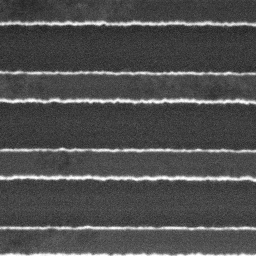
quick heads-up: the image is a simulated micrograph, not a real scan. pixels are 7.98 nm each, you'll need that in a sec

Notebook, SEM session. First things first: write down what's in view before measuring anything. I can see lines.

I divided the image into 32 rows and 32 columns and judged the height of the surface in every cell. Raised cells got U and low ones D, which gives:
UUUUUUUUUUUUUUUUUUUUUUUUUUUUUUUU
UUUUUUUUUUUUUUUUUUUUUUUUUUUUUUUU
UUUUUUUUUUUUUUUUUUUUUUUUUUUUUUUU
DDDDDDDDDDDDDDDDDDDDDDDDDDDDDDDD
DDDDDDDDDDDDDDDDDDDDDDDDDDDDDDDD
DDDDDDDDDDDDDDDDDDDDDDDDDDDDDDDD
DDDDDDDDDDDDDDDDDDDDDDDDDDDDDDDD
DDDDDDDDDDDDDDDDDDDDDDDDDDDDDDDD
DDDDDDDDDDDDDDDDDDDDDDDDDDDDDDDD
UUUUUUUUUUUUUUUUUUUUUUUUUUUUUUUU
UUUUUUUUUUUUUUUUUUUUUUUUUUUUUUUU
UUUUUUUUUUUUUUUUUUUUUUUUUUUUUUUU
UUUUUUUUUUUUUUUUUUUUUUUUUUUUUUUU
DDDDDDDDDDDDDDDDDDDDDDDDDDDDDDDD
DDDDDDDDDDDDDDDDDDDDDDDDDDDDDDDD
DDDDDDDDDDDDDDDDDDDDDDDDDDDDDDDD
DDDDDDDDDDDDDDDDDDDDDDDDDDDDDDDD
DDDDDDDDDDDDDDDDDDDDDDDDDDDDDDDD
DDDDDDDDDDDDDDDDDDDDDDDDDDDDDDDD
UUUUUUUUUUUUUUUUUUUUUUUUUUUUUUUU
UUUUUUUUUUUUUUUUUUUUUUUUUUUUUUUU
UUUUUUUUUUUUUUUUUUUUUUUUUUUUUUUU
DDDDDDDDDDDDDDDDDDDDDDDDDDDDDDDU
DDDDDDDDDDDDDDDDDDDDDDDDDDDDDDDD
DDDDDDDDDDDDDDDDDDDDDDDDDDDDDDDD
DDDDDDDDDDDDDDDDDDDDDDDDDDDDDDDD
DDDDDDDDDDDDDDDDDDDDDDDDDDDDDDDD
DDDDDDDDDDDDDDDDDDDDDDDDDDDDDDDD
UUUUUUUUUUUUUUUUUUUDUUUUUUDDDUUU
UUUUUUUUUUUUUUUUUUUUUUUUUUUUUUUU
UUUUUUUUUUUUUUUUUUUUUUUUUUUUUUUU
UUUUUUUUUUUUUUUUUUUUUUUUUUUUUUUU